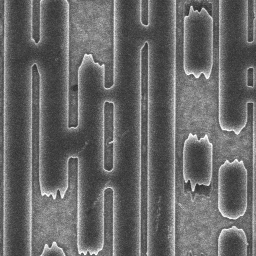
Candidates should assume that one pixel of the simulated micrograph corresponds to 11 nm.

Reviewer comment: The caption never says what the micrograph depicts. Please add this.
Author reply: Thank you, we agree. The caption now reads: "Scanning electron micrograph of parallel lines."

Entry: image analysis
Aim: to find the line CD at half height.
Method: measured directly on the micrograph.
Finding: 0.303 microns